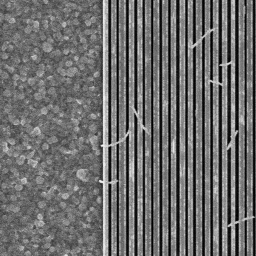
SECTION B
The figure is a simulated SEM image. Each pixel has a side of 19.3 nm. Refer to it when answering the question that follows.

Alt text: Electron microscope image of parallel lines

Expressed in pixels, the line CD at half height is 5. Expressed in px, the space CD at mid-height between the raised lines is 3.37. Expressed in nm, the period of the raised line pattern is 163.